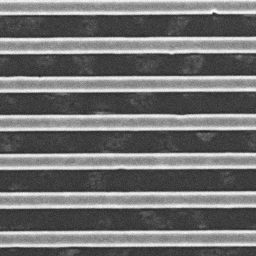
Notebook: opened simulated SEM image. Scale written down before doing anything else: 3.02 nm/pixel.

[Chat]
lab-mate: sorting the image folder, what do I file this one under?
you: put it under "parallel lines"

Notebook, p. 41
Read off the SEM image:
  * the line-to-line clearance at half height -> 75.2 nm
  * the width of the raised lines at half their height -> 0.0419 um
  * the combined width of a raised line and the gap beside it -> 0.117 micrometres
